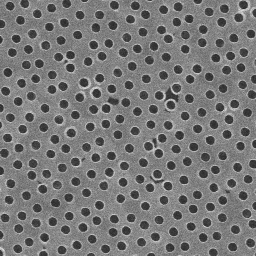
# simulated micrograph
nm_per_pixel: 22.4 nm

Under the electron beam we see a regular array of holes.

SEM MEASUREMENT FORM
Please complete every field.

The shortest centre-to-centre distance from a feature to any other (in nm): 330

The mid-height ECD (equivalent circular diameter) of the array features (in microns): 0.205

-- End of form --